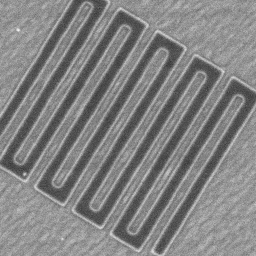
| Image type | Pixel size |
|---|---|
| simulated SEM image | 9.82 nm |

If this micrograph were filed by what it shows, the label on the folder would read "groups of lines, slits or small figures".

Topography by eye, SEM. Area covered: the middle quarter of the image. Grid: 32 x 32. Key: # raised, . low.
##...####..####...###...####...#
#...####...###...####...###...##
#..####...####..####...####..###
...####..####...####..####...###
..####...####..####...####..####
..###...####...###...####..####.
.####..####...####...###...####.
####...####..####...####..####..
####..####...####..####...####..
###..####...####...####..####..#
##...####..####...####..####...#
##..####...####..####...####..##
#...####..####...####..####...##
#..####...####..####...####..###
..####...####..####...####...###
..####..####...####..####...####
.####...####..####...####..####.
.####..####...####..####...####.
####..#####..####...###...####..
###...####..####...####..####...
###..####...####..####...####..#
##...####..####...####..####...#
#...####...###...####...###...##
#..####...####...###...####...##
...####...###...####..####...###
..####...####..####...####..####
..####..####...####..####.#.####
.####...###...####...###...####.
####...####..####...####..####..
####..####...####..####...####..
###...####..####...####..####...
##...####..####...####...####..#